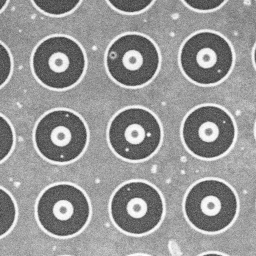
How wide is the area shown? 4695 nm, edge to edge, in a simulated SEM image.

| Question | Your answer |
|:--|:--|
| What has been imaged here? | an array of small figures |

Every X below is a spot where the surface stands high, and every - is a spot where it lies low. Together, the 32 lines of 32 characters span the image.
-XXX------XXXX-----XXXX-----XXXX
XXXXX----XXXXXX--XXXXXXXXXXXXXXX
XXXXXXXXXXXXXXXXXXXXXXXXXXXXXXXX
XXXXXXXXXXXXXXXXXXXXXXXXXXXXXXXX
XXXXXXX-XXXXXXX---XXXXXX----XXXX
XXXXX-----XXXX-----XXXX------XXX
-XXX-------XX-------XXX--X---XXX
-XXX---X---XX---X---XX---XX--XXX
-XXX---X---XX-------XXX------XXX
-XXX------XXXX-----XXXX-----XXXX
XXXXX----XXXXXX---XXXXXXX--XXXXX
XXXXXXXXXXXXXXXXXXXXXXXXXXXXXXXX
XXXXXXXXXXXXXXXXXXXXXXXXXXXXXXXX
XXXXXXXXXXXXXXXX--XXXXXXX---XXXX
XXXXX-----XXXX-----XXXX------XXX
-XXXX------XXX------XXX------XXX
--XX---X---XX---XX--XXX--XX--XXX
--XX---X---XXX--X---XXX------XXX
--XXX------XXX------XXX------XXX
-XXXX-----XXXXX----XXXXXX---XXXX
XXXXXXXXXXXXXXXXXXXXXXXXXXXXXXXX
XXXXXXXXXXXXXXXXXXXXXXXXXXXXXXXX
XXXXXXXXXXXXXXXXXXXXXXXXXX-XXXXX
XXXXXX----XXXXX----XXXXX-----XXX
-XXXX------XXX------XXX------XXX
--XXX--X---XXX--XX--XXX--XX---XX
--XXX--XX--XXX--XX--XXX---X---XX
--XXX------XXX------XXXX-----XXX
-XXXX-----XXXXX----XXXXX----XXXX
XXXXXXX--XXXXXXXXXXXXXXXXXXXXXXX
XXXXXXXXXXXXXXXXXXXXXXXXXXXXXXXX
XXXXXXXXXXXXXXXXXXXXXXXXXXXXXXXX